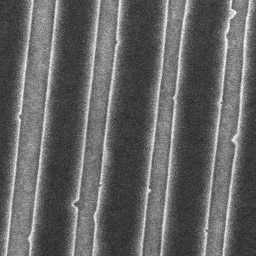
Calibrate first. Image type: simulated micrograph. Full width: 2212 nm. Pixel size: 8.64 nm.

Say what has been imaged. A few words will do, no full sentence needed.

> one or a few lines or trenches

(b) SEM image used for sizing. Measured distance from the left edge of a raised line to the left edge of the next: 561 nm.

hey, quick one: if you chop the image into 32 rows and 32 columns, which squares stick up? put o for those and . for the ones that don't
oooo...ooooo...oooooo..oooooo..o
oooo...ooooo...oooooo..oooooo..o
oooo...ooooo...oooooo..oooooo..o
oooo...ooooo...oooooo..oooooo..o
oooo...ooooo...oooooo..ooooo...o
ooo....ooooo...ooooo...ooooo...o
ooo...oooooo..oooooo...ooooo...o
ooo...oooooo..oooooo..oooooo..oo
ooo...oooooo..oooooo..oooooo..oo
ooo...oooooo..oooooo..oooooo..oo
ooo...ooooo...oooooo..oooooo..oo
ooo...ooooo...oooooo..oooooo..oo
ooo...ooooo...oooooo..oooooo..oo
ooo...ooooo...oooooo..oooooo..oo
oo....ooooo..ooooooo..ooooo...oo
oo....ooooo..oooooo...ooooo...oo
oo...oooooo..oooooo...ooooo...oo
oo...oooooo..oooooo...ooooo..ooo
oo...oooooo..oooooo..oooooo..ooo
oo...ooooo...oooooo..oooooo..ooo
oo...ooooo...oooooo..oooooo..ooo
oo...ooooo...oooooo..oooooo..ooo
oo...ooooo...oooooo..ooooo...ooo
oo...ooooo..ooooooo..ooooo...ooo
oo..oooooo..oooooo...ooooo...ooo
o...ooooo...oooooo...ooooo...ooo
o...oooooo..oooooo...ooooo..oooo
o...oooooo..oooooo..oooooo..oooo
o...oooooo..oooooo..oooooo..oooo
o...ooooo...oooooo..oooooo..oooo
o...ooooo...oooooo..oooooo..oooo
o...ooooo...oooooo..oooooo..oooo